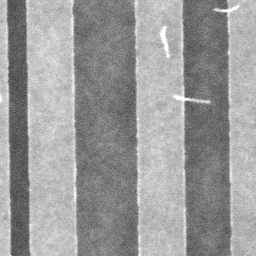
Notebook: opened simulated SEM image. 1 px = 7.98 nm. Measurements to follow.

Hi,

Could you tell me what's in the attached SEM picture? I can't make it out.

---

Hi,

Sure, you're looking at lines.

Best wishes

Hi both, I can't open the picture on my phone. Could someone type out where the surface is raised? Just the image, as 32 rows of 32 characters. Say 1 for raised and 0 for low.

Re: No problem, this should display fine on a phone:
10011111100000000111111000000111
10011111100000000111111000001111
10011111100000000111111000000111
10011111100000000111111000000111
10011111100000000111111000000111
10011111100000000111111000000111
10011111100000000111111000000111
10011111100000000111111000000111
10001111100000000111111000000111
10001111100000000111111000000111
10001111100000000111111000000111
10001111100000000111111000000111
10001111100000000111111000000111
10001111100000000111111000000111
10001111100000000111111000000111
10001111100000000111111000000111
10001111100000000111111000000111
10001111100000000111111000000111
10001111100000000111111000000111
10001111100000000111111000000111
10001111100000000111111000000111
10001111100000000111111000000111
10001111100000000111111000000111
10001111100000000111111000000111
10001111100000000111111000000111
10001111100000000111111000000111
10001111100000000111111000000111
10001111100000000111111000000111
10001111100000000111111000000111
10001111110000000111111000000111
10001111110000000111111000000111
10001111110000000111111000000111